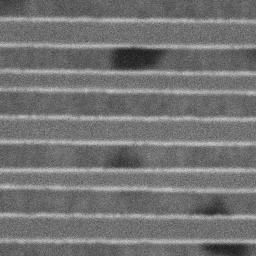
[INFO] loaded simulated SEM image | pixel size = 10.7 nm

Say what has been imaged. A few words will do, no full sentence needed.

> lines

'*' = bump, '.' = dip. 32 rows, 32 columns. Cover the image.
................................
................................
************....................
********************************
********************************
********************************
................................
................................
................................
********************************
********************************
......................**********
................................
................................
................................
********************************
********************************
********************************
................................
................................
................................
********************************
********************************
.......*************************
................................
................................
................................
********************************
********************************
********************************
................................
................................